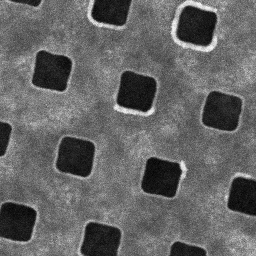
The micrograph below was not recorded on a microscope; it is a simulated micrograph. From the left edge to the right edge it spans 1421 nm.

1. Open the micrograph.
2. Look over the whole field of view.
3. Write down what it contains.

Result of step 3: holes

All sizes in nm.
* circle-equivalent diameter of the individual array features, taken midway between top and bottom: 224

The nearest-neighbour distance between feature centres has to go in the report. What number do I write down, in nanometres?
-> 487